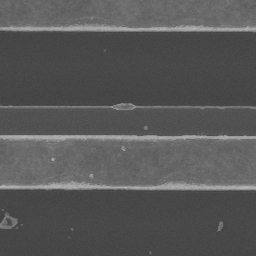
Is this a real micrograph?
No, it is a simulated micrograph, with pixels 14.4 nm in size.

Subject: lines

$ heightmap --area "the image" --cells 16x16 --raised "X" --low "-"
XXXXXXXXXXXXXXXX
XXXXXXXXXXXXXXXX
----------------
----------------
----------------
----------------
----------------
----------------
XXXXXXXXXX-XXXXX
XXXXXXXXXXXXXXXX
XXXXXXXXXXXXXXXX
XXXXXXXXXXXXXXXX
----------------
----------------
----------------
----------------